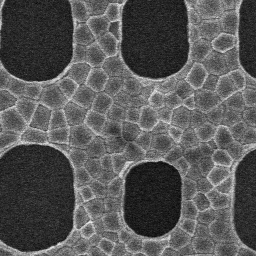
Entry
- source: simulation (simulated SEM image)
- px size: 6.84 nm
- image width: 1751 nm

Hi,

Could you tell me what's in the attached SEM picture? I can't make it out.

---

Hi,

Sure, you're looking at holes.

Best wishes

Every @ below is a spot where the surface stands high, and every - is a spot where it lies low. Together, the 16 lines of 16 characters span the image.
----@@@@----@@@-
-----@@@----@@@-
-----@@@----@@@-
----@@@@----@@@-
@---@@@@---@@@@-
@@@@@@@@@@@@@@@@
@@@@@@@@@@@@@@@@
@@@@@@@@@@@@@@@@
@@@@@@@@@@@@@@@@
----@@@@@@@@@@@@
-----@@@---@@@@-
-----@@@---@@@@-
-----@@@---@@@@-
-----@@@---@@@@-
----@@@@--@@@@@-
@--@@@@@@@@@@@@@